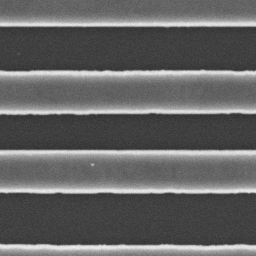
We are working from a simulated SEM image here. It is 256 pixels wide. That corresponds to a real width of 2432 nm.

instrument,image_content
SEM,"lines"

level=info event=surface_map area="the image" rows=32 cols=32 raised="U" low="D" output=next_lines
UUUUUUUUUUUUUUUUUUUUUUUUUUUUUUUU
UUUUUUUUUUUUUUUUUUUUUUUUUUUUUUUU
UUUUUUUUUUUUUUUUUUUUUUUUUUUUUUUU
DDDDDDDDDDDDDDDDDDDDDDDDDDDDDDDD
DDDDDDDDDDDDDDDDDDDDDDDDDDDDDDDD
DDDDDDDDDDDDDDDDDDDDDDDDDDDDDDDD
DDDDDDDDDDDDDDDDDDDDDDDDDDDDDDDD
DDDDDDDDDDDDDDDDDDDDDDDDDDDDDDDD
DDDDDDDDDDDDDDDDDDDDDDDDDDDDDDDD
UUUUUUUUUUUUUUUUUUUUUUUUUUUUUUUU
UUUUUUUUUUUUUUUUUUUUUUUUUUUUUUUU
UUUUUUUUUUUUUUUUUUUUUUUUUUUUUUUU
UUUUUUUUUUUUUUUUUUUUUUUUUUUUUUUU
UUUUUUUUUUUUUUUUUUUUUUUUUUUUUUUU
DDDDDDDDDDDDDDDDDDDDDDDDDDDDDDDD
DDDDDDDDDDDDDDDDDDDDDDDDDDDDDDDD
DDDDDDDDDDDDDDDDDDDDDDDDDDDDDDDD
DDDDDDDDDDDDDDDDDDDDDDDDDDDDDDDD
DDDDDDDDDDDDDDDDDDDDDDDDDDDDDDDD
UUUUUUUUUUUUUUUUUUUUUUUUUUUUUUUU
UUUUUUUUUUUUUUUUUUUUUUUUUUUUUUUU
UUUUUUUUUUUUUUUUUUUUUUUUUUUUUUUU
UUUUUUUUUUUUUUUUUUUUUUUUUUUUUUUU
UUUUUUUUUUUUUUUUUUUUUUUUUUUUUUUU
DDDDDDDDDDDDDDDDDDDDDDDDDDDDDDDD
DDDDDDDDDDDDDDDDDDDDDDDDDDDDDDDD
DDDDDDDDDDDDDDDDDDDDDDDDDDDDDDDD
DDDDDDDDDDDDDDDDDDDDDDDDDDDDDDDD
DDDDDDDDDDDDDDDDDDDDDDDDDDDDDDDD
DDDDDDDDDDDDDDDDDDDDDDDDDDDDDDDD
DDDDDDDDDDDDDDDDDDDDDDDDDDDDDDDD
UUUUUUUUUUUUUUUUUUUUUUUUUUUUUUUU